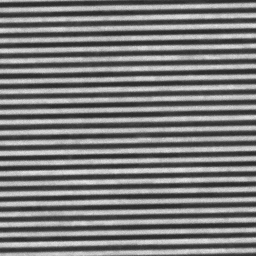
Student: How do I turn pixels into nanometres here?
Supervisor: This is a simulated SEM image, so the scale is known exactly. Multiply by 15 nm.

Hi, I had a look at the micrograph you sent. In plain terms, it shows parallel lines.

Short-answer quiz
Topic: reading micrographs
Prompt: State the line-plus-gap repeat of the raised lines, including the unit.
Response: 153 nm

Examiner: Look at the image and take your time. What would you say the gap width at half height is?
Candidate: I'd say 84.2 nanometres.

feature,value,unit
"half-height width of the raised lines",71.1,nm